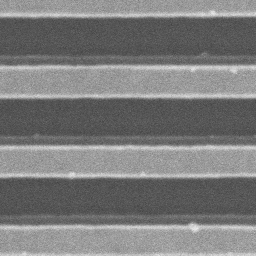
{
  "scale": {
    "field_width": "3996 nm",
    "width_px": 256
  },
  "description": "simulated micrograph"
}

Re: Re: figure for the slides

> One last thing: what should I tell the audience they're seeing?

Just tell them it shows lines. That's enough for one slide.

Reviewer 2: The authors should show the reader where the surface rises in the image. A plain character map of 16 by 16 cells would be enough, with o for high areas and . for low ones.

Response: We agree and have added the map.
oooooooooooooooo
................
................
................
oooooooooooooooo
oooooooooooooooo
................
................
................
oooooooooooooooo
oooooooooooooooo
................
................
................
oooooooooooooooo
oooooooooooooooo